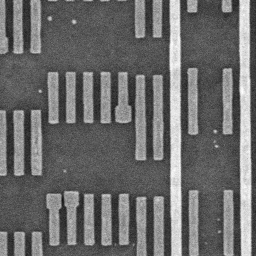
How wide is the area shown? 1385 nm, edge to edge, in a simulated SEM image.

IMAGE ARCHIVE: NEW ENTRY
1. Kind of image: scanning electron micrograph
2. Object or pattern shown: wiring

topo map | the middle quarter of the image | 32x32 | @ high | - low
---------------------------@@---
---------------------------@@--@
-@@--@@--@@---@@-----------@@--@
-@@--@@--@@---@@--@@--@@---@@--@
-@@--@@--@@---@@--@@--@@---@@--@
-@@--@@--@@---@@--@@--@@---@@--@
-@@--@@--@@---@@--@@--@@---@@--@
-@@--@@--@@---@@--@@---@---@@--@
-@@--@@--@@---@@--@@---@---@@--@
-@@--@@--@@---@@--@@---@---@@--@
-@@--@@--@@--@@@--@@---@---@@--@
-@@--@@--@@--@@@@-@@---@---@@--@
-@@--@@--@@--@@@@-@@---@---@@--@
-@@--@@--@@--@@@@-@@--@@---@@--@
-@@--@@--@@--@@@--@@--@@@--@@--@
------------------@@--@@@--@@--@
------------------@@--@@@--@@--@
------------------@@--@@@--@@---
------------------@@--@@---@@---
------------------@@--@@---@@---
------------------@@--@@---@@---
------------------@@--@@---@@---
------------------@@---@---@@---
------------------@@---@---@@---
---------------------------@@---
---------------------------@@---
---------------------------@@---
---------------------------@@---
---------------------------@@---
---------------------------@@---
---------------------------@@---
---------------------------@@---